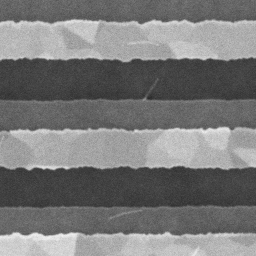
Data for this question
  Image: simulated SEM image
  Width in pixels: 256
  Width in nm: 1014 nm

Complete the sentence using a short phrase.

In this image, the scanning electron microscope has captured lines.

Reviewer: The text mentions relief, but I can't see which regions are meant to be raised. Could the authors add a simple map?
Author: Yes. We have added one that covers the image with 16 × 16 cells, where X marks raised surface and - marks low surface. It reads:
XXXXXXXXXXXXXXXX
XXXXXXXXXXXXXXXX
XXXXXXXXXXXXXXXX
XXXXXXXXXXXXXXXX
----------------
----------------
XXXXXXXXXXXXXXXX
XXXXXXXXXXXXXXXX
XXXXXXXXXXXXXXXX
XXXXXXXXXXXXXXXX
---X----------X-
----------------
----------------
XXXXXXXXXXXXXXXX
XXXXXXXXXXXXXXXX
XXXXXXXXXXXXXXXX